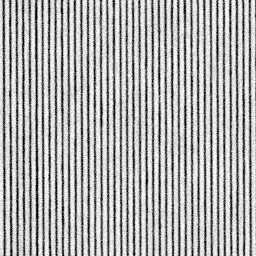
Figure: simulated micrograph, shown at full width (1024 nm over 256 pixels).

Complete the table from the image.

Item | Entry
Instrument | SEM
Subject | parallel lines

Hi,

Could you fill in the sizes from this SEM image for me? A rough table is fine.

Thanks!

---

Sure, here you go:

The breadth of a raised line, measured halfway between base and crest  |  0.016 µm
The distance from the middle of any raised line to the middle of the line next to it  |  25.9 nm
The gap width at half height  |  8 nanometers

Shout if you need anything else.